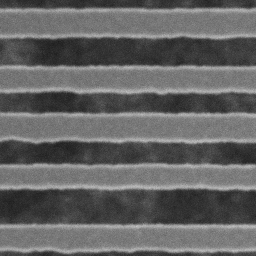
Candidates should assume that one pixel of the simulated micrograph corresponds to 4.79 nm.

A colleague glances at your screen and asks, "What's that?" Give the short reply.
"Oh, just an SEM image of lines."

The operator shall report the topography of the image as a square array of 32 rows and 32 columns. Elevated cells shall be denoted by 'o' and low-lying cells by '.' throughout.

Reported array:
................................
oooooooooooooooooooooooooooooooo
oooooooooooooooooooooooooooooooo
oooooooooooooooooooooooooooooooo
oooooooooooooooooooooooooooooooo
................................
................................
................................
oooooooooooooooooooooooooooooooo
oooooooooooooooooooooooooooooooo
oooooooooooooooooooooooooooooooo
ooooo....ooooooooo.ooooooooooooo
................................
................................
oooooooooooooooooooooooooooooooo
oooooooooooooooooooooooooooooooo
oooooooooooooooooooooooooooooooo
o.oooooooooooooooooooooooooooooo
................................
................................
................................
oooooooooooooooooooooooooooooooo
oooooooooooooooooooooooooooooooo
oooooooooooooooooooooooooooooooo
................................
................................
................................
................................
oooooooooooooooooooooooooooooooo
oooooooooooooooooooooooooooooooo
oooooooooooooooooooooooooooooooo
........o.......................